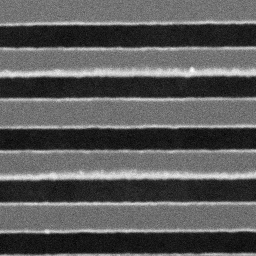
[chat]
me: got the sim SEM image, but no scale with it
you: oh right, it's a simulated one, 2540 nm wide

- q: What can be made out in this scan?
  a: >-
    lines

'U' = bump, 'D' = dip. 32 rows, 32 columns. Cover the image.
UUUUUUUUUUUUUUUUUUUUUUUUUUUUUUUU
UUUUUUUUUUUUUUUUUUUUUUUUUUUUUUUU
UUUUUUUUUUUUUUUUUUUUUUUUUUUUUUUU
DDDDDDDDDDDDDDDDDDDDDDDDDDDDDDDD
DDDDDDDDDDDDDDDDDDDDDDDDDDDDDDDD
DDDDDDDDDDDDDDDDDDDDDDDDDDDDDDDD
UUUUUUUUUUUUUUUUUUUUUUUUUUUUUUUU
UUUUUUUUUUUUUUUUUUUUUUUUUUUUUUUU
UUUUUUUUUUUUUUUUUUUUUUUUUUUUUUUU
UUUUUDUUUUUDUDDDDDDDDDUUDDDDDDDD
DDDDDDDDDDDDDDDDDDDDDDDDDDDDDDDD
DDDDDDDDDDDDDDDDDDDDDDDDDDDDDDDD
UUUUUUUUUUUUUUUUUUUUUUUUUUUUUUUU
UUUUUUUUUUUUUUUUUUUUUUUUUUUUUUUU
UUUUUUUUUUUUUUUUUUUUUUUUUUUUUUUU
UUUUUUUUUUUUUUUUUUUUUUUUUUUUUUUU
DDDDDDDDDDDDDDDDDDDDDDDDDDDDDDDD
DDDDDDDDDDDDDDDDDDDDDDDDDDDDDDDD
DDDDDDDDDDDDDDDDDDDDDDDDDDDDDDDD
UUUUUUUUUUUUUUUUUUUUUUUUUUUUUUUU
UUUUUUUUUUUUUUUUUUUUUUUUUUUUUUUU
UUUUUUUUUUUUUUUUUUUUUUUUUUUUUUUU
DDDDUDDDDDDDDDDDDDDDDDDDDDDDDDDD
DDDDDDDDDDDDDDDDDDDDDDDDDDDDDDDD
DDDDDDDDDDDDDDDDDDDDDDDDDDDDDDDD
UUUUUUUUUUUUUUUUUUUUUUUUUUUUUUUU
UUUUUUUUUUUUUUUUUUUUUUUUUUUUUUUU
UUUUUUUUUUUUUUUUUUUUUUUUUUUUUUUU
UUUUUUUUUUUUUUUUUUUUUUUUUUUUUUUU
DDDDDDDDDDDDDDDDDDDDDDDDDDDDDDDD
DDDDDDDDDDDDDDDDDDDDDDDDDDDDDDDD
DDDDDDDDDDDDDDDDDDDDDDDDDDDDDDDD